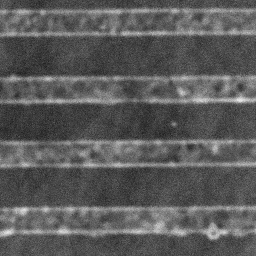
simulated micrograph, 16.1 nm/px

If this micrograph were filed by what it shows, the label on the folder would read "lines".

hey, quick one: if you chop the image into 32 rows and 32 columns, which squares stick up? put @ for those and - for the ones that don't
--------------------------------
@@@@@@@@@@@@@@@@@@@@@@@@@@@@@@@@
@@@@@@@@@@@@@@@@@@@@@@@@@@@@@@@@
@@@@@@@@@@@@@@@@@@@@@@@@@@@@@@@@
--------------------------------
--------------------------------
--------------------------------
--------------------------------
--------------------------------
--------------------------------
@@@@@@@@@@@@@@@@@@@@@@@@@@@@@@@@
@@@@@@@@@@@@@@@@@@@@@@@@@@@@@@@@
@@@@@@@@@@@@@@@@@@@@@@@@@@@@@@@@
--------------------------------
--------------------------------
--------------------------------
--------------------------------
--------------------------------
@@@@@@@@@@@@@@@@@@@@@@@@@@@@@@@@
@@@@@@@@@@@@@@@@@@@@@@@@@@@@@@@@
@@@@@@@@@@@@@@@@@@@@@@@@@@@-----
--------------------------------
--------------------------------
--------------------------------
--------------------------------
--------------------------------
@@@@@@@@@@@@@@@@@@@@@@@@@@@@@@@@
@@@@@@@@@@@@@@@@@@@@@@@@@@@@@@@@
@@@@@@@@@@@@@@@@@@@@@@@@@@@@@@@@
--------------------------@-----
--------------------------------
--------------------------------